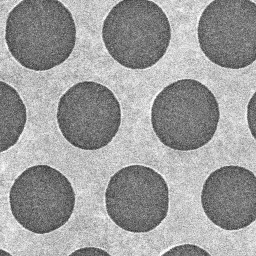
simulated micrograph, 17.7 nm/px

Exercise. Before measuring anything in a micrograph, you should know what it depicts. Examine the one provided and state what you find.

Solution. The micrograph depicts holes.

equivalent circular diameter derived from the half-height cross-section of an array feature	1190	nanometers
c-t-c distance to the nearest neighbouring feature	1700	nanometres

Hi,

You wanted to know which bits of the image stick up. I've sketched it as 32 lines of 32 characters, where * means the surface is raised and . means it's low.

**......*******.....******......
*........*****.......****.......
*........****........****.......
*........****........****.......
*.........***........****.......
*........****........****.......
*........****........****.......
**......******......******......
***....*********...*********..**
********************************
.********....********....*******
..******......******......******
...****........****........****.
...****........****........****.
...****........****........****.
...****........****........****.
...****........****........****.
..******......******......******
.*********...********....*******
********************************
********************************
***.....*******.....*******.....
**.......*****.......*****......
*........****........****.......
*........****........****.......
*........****........****.......
*........****........*****......
**.......*****......******......
***....********....********...**
********************************
***********************.********
.********....*******......******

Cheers